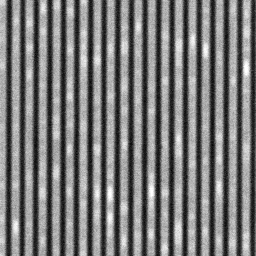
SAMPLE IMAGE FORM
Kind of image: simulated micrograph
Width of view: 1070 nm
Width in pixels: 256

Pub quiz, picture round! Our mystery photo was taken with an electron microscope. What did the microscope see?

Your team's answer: parallel lines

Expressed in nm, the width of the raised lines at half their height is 28.7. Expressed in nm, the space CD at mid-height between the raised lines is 28.7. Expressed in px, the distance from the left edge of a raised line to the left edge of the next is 13.6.